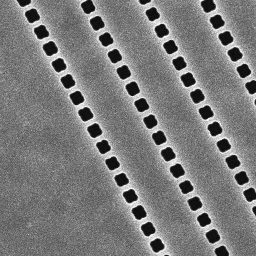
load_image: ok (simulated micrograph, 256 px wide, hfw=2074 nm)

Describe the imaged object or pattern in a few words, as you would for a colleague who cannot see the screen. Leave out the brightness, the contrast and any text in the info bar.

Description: a regular array of holes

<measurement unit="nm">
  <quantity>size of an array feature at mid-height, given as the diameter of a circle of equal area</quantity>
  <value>108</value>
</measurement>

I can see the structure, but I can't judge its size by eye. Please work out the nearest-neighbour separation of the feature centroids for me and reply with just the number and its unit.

150 nm